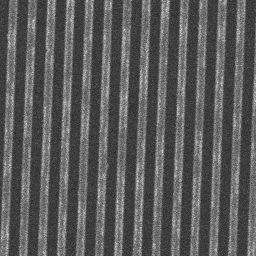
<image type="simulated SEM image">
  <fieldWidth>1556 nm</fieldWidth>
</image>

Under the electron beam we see parallel lines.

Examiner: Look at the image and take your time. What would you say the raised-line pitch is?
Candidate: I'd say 116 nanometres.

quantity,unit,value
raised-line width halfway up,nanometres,42.5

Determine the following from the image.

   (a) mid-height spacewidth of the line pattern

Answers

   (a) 72.9 nm